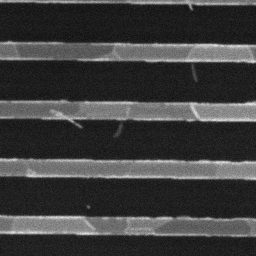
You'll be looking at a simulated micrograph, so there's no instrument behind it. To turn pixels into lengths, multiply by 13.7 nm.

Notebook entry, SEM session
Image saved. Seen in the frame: lines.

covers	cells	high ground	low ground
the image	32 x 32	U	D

DDDDDDDDDDDDDDDDDDDDDDDUUUUUUUUU
DDDDDDDDDDDDDDDDDDDDDDDDDDDDDDDD
DDDDDDDDDDDDDDDDDDDDDDDDDDDDDDDD
DDDDDDDDDDDDDDDDDDDDDDDDDDDDDDDD
DDDDDDDDDDDDDDDDDDDDDDDDDDDDDDDD
UUUUUUUUUUUUUUUUDDDDDDDDDDDDDDDD
UUUUUUUUUUUUUUUUUUUUUUUUUUUUUUUU
DDDDDDDDDDUUUUUUUUUUUUUUUUUUUUUU
DDDDDDDDDDDDDDDDDDDDDDDDDDDDDDDD
DDDDDDDDDDDDDDDDDDDDDDDDDDDDDDDD
DDDDDDDDDDDDDDDDDDDDDDDDDDDDDDDD
DDDDDDDDDDDDDDDDDDDDDDDDDDDDDDDD
DDDDDDDDDDDDDDDDDDDDDDDDDDDDDDDD
UUUUUUUUUUUUUUUUUUUUUUUUUUUUUUUU
UUUUUUUUUUUUUUUUUUUUUUUUUUUUUUUU
DDDDDDDDDDDDDDDDDDDDDDDDDDDDDDDD
DDDDDDDDDDDDDDDDDDDDDDDDDDDDDDDD
DDDDDDDDDDDDDDDDDDDDDDDDDDDDDDDD
DDDDDDDDDDDDDDDDDDDDDDDDDDDDDDDD
DDDDDDDDDDDDDDDDDDDDDDDDDDDDDDDD
UUUUUUUUUUUUUUUUUUUUUUUUUUUUUUUU
UUUUUUUUUUUUUUUUUUUUUUUUUUUUUUUU
DDDDDDDDDDDDDDDDDDDDDDDDDDDDDDDD
DDDDDDDDDDDDDDDDDDDDDDDDDDDDDDDD
DDDDDDDDDDDDDDDDDDDDDDDDDDDDDDDD
DDDDDDDDDDDDDDDDDDDDDDDDDDDDDDDD
DDDDDDDDDDDDDDDDDDDDDDDDDDDDDDDD
UUUUUUUUUUUUUUUUUUUUUUUUUUUUUUUU
UUUUUUUUUUUUUUUUUUUUUUUUUUUUUUUU
DDDDDDDDDDDDDDDDDDDDDDDDDDDDDDDD
DDDDDDDDDDDDDDDDDDDDDDDDDDDDDDDD
DDDDDDDDDDDDDDDDDDDDDDDDDDDDDDDD